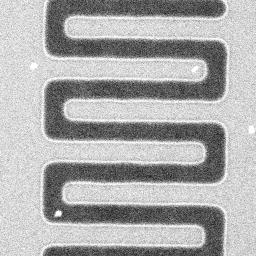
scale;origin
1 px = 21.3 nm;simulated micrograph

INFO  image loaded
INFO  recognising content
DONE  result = groups of lines, slits or small figures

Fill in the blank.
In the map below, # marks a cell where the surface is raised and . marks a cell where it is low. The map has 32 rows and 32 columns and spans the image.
......######################....
......######################....
......###.......................
.....###........................
.....####.......................
.....#######################....
......#######################...
.....................########...
..........................##....
.........................###....
......######################....
.....#######################....
.....#######################....
.....###........................
.....###........................
.....#######################....
.....#######################....
......######################....
.........................###....
.........................###....
......######################....
.....#######################....
.....#######################....
.....###........................
.....###........................
.....###############.####.......
.....#######################....
......######################....
.........................###....
.........................###....
.........................###....
.....#######################....